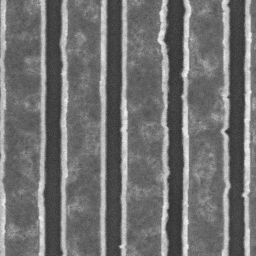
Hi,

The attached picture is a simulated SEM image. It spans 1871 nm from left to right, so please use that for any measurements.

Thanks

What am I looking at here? one or a few lines or trenches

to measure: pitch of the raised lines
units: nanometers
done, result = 446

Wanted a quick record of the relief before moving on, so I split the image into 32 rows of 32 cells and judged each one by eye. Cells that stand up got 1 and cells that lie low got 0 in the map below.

11111000111110001111100111110001
11111000111110001111000111110001
11111000111110001111000111110001
11111000111110001111000111110001
11111000111110001111000111110001
11111000111110001111000111110001
11111000111110001111100111110001
11111000111110001111100111110001
11111000111110001111100111110001
11111000111110001111100111110001
11111000111110001111100111110001
11111000111110001111100111110001
11111000111110011111100111110001
11111000111110011111100111110001
11111000111110001111000111110001
11111000111110011111100111110001
11111000111110011111100111110001
11111000111110011111100111110001
11111000111110001111100111110001
11111000111110001111100111110001
11111000111110011111100111110001
11111000111110011111100111110001
11111000111110001111100111110001
11111000111110001111100111110001
11111000111110011111100111110001
11111000111110011111100111110001
11111000111110001111100111110001
11111000111110001111100111110001
11111000111110001111000111110001
11111000111110001111000111110001
11111000111110011111000111110001
11111000111110011111100111110001